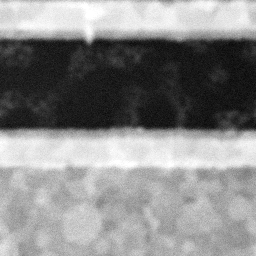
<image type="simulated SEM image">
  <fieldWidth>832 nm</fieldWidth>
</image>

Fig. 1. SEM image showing one or a few lines or trenches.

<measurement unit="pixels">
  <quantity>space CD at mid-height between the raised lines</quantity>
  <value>132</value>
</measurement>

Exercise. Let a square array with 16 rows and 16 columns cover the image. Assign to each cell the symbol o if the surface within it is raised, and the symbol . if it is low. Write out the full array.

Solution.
oooooooooooooooo
................
................
................
................
................
................
................
................
oooooooooooo...o
oooooooooooooooo
oooooooooooooooo
oooooooooooooooo
oooooooooooooooo
oooooooooooooooo
oooooooooooooooo